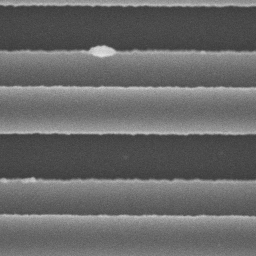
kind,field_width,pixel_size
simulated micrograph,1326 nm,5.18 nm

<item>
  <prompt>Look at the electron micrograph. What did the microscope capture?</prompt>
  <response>lines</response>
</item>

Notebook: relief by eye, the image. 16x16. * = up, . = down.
................
................
................
****************
****************
****************
****************
****************
................
................
................
****************
****************
****************
****************
****************